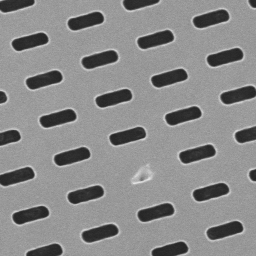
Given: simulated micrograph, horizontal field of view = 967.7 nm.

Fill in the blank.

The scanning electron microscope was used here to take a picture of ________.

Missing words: a regular array of holes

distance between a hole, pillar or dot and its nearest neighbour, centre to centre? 154 nm